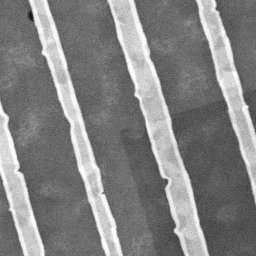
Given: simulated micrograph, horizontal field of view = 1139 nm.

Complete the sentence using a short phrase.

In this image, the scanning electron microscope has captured one or a few lines or trenches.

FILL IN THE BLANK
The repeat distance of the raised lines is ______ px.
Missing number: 79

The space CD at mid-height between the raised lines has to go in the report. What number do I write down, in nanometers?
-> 274